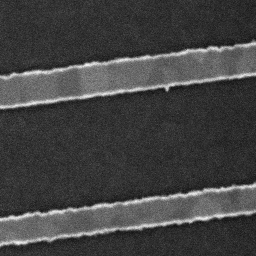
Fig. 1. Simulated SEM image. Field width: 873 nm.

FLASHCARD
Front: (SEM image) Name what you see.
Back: one or a few lines or trenches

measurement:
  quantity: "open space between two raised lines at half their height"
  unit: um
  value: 0.375